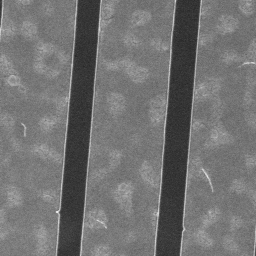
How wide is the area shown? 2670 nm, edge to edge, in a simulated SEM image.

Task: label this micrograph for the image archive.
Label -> one or a few lines or trenches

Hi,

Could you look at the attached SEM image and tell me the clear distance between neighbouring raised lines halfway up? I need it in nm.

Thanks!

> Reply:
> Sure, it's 762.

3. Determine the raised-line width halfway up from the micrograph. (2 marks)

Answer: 268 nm